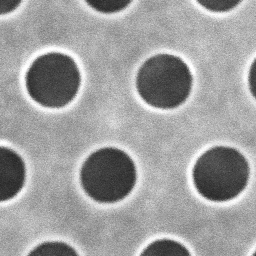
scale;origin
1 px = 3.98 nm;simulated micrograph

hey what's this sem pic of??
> holes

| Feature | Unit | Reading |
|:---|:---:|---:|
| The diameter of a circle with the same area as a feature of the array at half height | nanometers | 226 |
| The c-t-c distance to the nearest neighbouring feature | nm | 434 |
